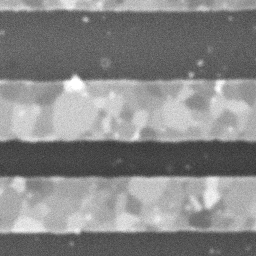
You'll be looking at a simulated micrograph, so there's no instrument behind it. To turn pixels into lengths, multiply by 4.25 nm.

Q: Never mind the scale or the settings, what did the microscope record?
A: lines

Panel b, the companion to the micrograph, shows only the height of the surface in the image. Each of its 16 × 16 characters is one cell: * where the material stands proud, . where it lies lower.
****************
................
................
................
................
****************
****************
****************
****************
................
................
****************
****************
****************
*..**...........
................